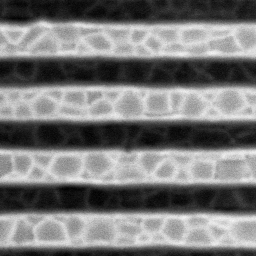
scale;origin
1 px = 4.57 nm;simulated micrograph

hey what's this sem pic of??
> parallel lines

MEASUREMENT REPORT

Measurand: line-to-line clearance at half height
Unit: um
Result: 0.127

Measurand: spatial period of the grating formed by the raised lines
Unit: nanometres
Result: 289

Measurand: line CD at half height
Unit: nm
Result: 161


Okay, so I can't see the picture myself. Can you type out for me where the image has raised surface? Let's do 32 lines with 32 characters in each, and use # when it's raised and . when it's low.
................................
................................
.....#..........................
################################
################################
################################
################################
................................
................................
................................
................................
################################
################################
################################
################################
................................
................................
................................
................................
################################
################################
################################
################################
................................
................................
................................
.........###..#.................
################################
################################
################################
################################
................................